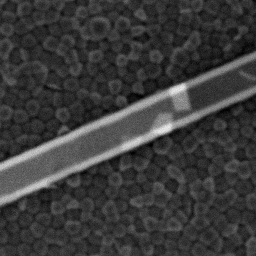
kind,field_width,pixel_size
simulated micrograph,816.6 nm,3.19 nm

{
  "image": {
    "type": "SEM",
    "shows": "one or a few lines or trenches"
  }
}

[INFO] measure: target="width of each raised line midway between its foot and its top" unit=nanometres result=104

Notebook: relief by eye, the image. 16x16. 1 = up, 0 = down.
0000000000000000
0000000000000000
0000000000000000
0000000000000000
0000000000000111
0000000000011111
0000000001111100
0000000111110000
0000111110000000
0011111000000000
1111100000000000
1110000000000000
0000000000000000
0000000000000000
0000000000000000
0000000000000000